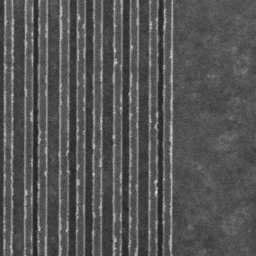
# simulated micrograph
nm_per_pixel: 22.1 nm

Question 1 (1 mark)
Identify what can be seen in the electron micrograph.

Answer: parallel lines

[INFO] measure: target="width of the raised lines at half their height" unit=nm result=177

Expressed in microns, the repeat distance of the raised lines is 0.392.